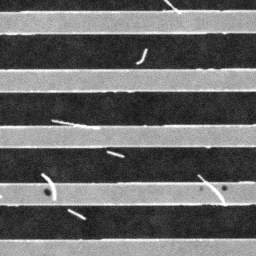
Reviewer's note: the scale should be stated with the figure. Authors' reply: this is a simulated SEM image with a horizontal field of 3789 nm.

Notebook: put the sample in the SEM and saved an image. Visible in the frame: lines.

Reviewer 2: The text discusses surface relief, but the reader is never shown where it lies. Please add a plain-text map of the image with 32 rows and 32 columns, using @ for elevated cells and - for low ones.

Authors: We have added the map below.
--------------------------------
--@@@@@@@@@@@@@@@@@@@@@@@@@@@@@@
@@@@@@@@@@@@@@@@@@@@@@@@@@@@@@@@
@@@@@@@@@@@@@@@@@@@@@@@@@@@@@@@@
--------------------------------
--------------------------------
--------------------------------
--------------------------------
--------------------------------
@@@@@@@@@@@@@@@@@@@@@@@@@@@@@@@@
@@@@@@@@@@@@@@@@@@@@@@@@@@@@@@@@
--------------------------------
--------------------------------
--------------------------------
--------------------------------
--------------------------------
@@@@@@@@@@@@@@@@@@@@@@@@@@@@@@@@
@@@@@@@@@@@@@@@@@@@@@@@@@@@@@@@@
--------------------------------
--------------------------------
--------------------------------
--------------------------------
--------------------------------
@@@@@@@@@@@@@@@@@@@@@@@@@@@@@@@@
@@@@@@@@@@@@@@@@@@@@@@@@@@@@@@@@
@@@@@@@@@@@@@@@@@@@@@@@@@@-@@@@-
--------------------------------
--------------------------------
--------------------------------
--------------------------------
@@@@@@@@@@@@@@@@@@@@@@@@@@@@@@@@
@@@@@@@@@@@@@@@@@@@@@@@@@@@@@@@@